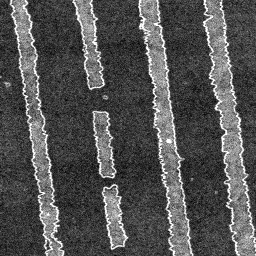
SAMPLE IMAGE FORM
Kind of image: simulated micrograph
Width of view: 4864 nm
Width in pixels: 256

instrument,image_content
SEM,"one or a few lines or trenches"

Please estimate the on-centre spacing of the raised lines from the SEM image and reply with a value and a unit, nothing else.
1210 nm